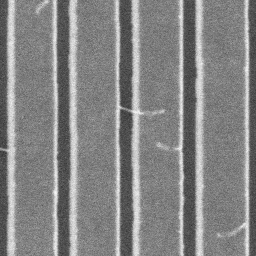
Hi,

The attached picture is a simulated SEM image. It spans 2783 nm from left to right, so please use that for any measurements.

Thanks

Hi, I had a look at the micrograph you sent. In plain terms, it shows lines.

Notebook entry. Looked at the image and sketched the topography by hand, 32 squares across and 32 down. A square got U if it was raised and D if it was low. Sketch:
DUUUUUUDDUUUUUUDDUUUUUUDDUUUUUUD
DUUUUUUDDUUUUUUDDUUUUUUDDUUUUUUD
DUUUUUUDDUUUUUUDDUUUUUUDDUUUUUUD
DUUUUUUDDUUUUUUDDUUUUUUDDUUUUUUD
DUUUUUUDDUUUUUUDDUUUUUUDDUUUUUUD
DUUUUUUDDUUUUUUDDUUUUUUDDUUUUUUD
DUUUUUUDDUUUUUUDDUUUUUUDDUUUUUUD
DUUUUUUDDUUUUUUDDUUUUUUDDUUUUUUD
DUUUUUUDDUUUUUUDDUUUUUUDDUUUUUUD
DUUUUUUDDUUUUUUDDUUUUUUDDUUUUUUD
DUUUUUUDDUUUUUUDDUUUUUUDDUUUUUUD
DUUUUUUDDUUUUUUDDUUUUUUDDUUUUUUD
DUUUUUUDDUUUUUUDDUUUUUUDDUUUUUUD
DUUUUUUDDUUUUUUDDUUUUUUDDUUUUUUD
DUUUUUUDDUUUUUUDDUUUUUUDDUUUUUUD
DUUUUUUDDUUUUUUDDUUUUUUDDUUUUUUD
DUUUUUUDDUUUUUUDDUUUUUUDDUUUUUUD
DUUUUUUDDUUUUUUDDUUUUUUDDUUUUUUD
DUUUUUUDDUUUUUUDDUUUUUUDDUUUUUUD
DUUUUUUDDUUUUUUDDUUUUUUDDUUUUUUD
DUUUUUUDDUUUUUUDDUUUUUUDDUUUUUUD
DUUUUUUDDUUUUUUDDUUUUUUDDUUUUUUD
DUUUUUUDDUUUUUUDDUUUUUUDDUUUUUUD
DUUUUUUDDUUUUUUDDUUUUUUDDUUUUUUD
DUUUUUUDDUUUUUUDDUUUUUUDDUUUUUUD
DUUUUUUDDUUUUUUDDUUUUUUDDUUUUUUD
DUUUUUUDDUUUUUUDDUUUUUUDDUUUUUUD
DUUUUUUDDUUUUUUDDUUUUUUDDUUUUUUD
DUUUUUUDDUUUUUUDDUUUUUUDDUUUUUUD
DUUUUUUDDUUUUUUDDUUUUUUDDUUUUUUD
DUUUUUUDDUUUUUUDDUUUUUUDDUUUUUUD
DUUUUUUDDUUUUUUDDUUUUUUDDUUUUUUD